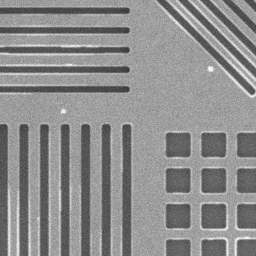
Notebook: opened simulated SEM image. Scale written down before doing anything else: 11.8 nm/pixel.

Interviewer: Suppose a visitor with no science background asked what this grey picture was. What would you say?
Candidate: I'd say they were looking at groups of lines, slits or small figures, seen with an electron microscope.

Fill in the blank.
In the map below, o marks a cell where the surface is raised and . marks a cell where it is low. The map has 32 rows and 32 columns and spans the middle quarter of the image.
................oooooooooooooooo
.................ooooooooooooooo
.......ooooooooooooooooooooooooo
oooooooooooooooooooooooooooooooo
oooooooooooooooooooooooooooooooo
................oooooooooooooooo
.................ooooooooooooooo
oooooooooooooooooooooooooooooooo
oooooooooooooooooooooooooooooooo
oooooooooooooooooooooooooooooooo
oooooooooooooooooooooooooooooooo
oooooooooooooooooooooooooooooooo
oooooooooooooooooooooooooooooooo
oooooooooooooooooooooooooooooooo
oooooooooooooooooooooooooooooooo
.ooo...ooo..ooo..ooooooooooooooo
..oo...oo...oo...ooooooooooooooo
..oo...oo...oo...oooooooo.......
..oo...oo...oo...oooooooo.......
..oo...oo...oo...oooooooo.......
..oo...oo...oo...oooooooo.......
..oo...oo...oo...oooooooo.......
..oo...oo...oo...oooooooo.......
..oo...oo...oo...ooooooooo.....o
..oo...oo...oo...ooooooooooooooo
..oo...oo...oo...ooooooooooooooo
..oo...oo...oo...oooooooo.......
..oo...oo...oo...oooooooo.......
..oo...oo...oo...oooooooo.......
..oo...oo...oo...oooooooo.......
..oo...oo...oo...oooooooo.......
..oo...oo...oo...oooooooo.......